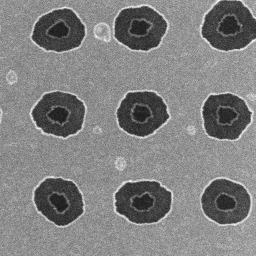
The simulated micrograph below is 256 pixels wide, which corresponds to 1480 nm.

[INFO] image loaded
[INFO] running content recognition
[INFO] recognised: a regular array of ring-shaped grooves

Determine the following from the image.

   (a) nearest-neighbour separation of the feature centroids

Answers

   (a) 480 nanometres